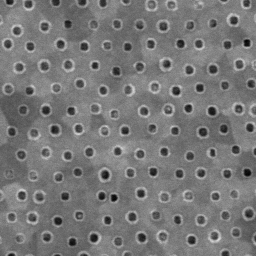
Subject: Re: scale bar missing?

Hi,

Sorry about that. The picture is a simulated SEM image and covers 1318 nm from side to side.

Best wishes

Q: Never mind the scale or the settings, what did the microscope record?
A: a regular array of holes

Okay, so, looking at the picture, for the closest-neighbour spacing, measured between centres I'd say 0.109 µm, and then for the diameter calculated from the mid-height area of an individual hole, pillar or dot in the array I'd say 45.8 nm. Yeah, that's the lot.